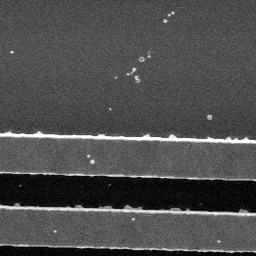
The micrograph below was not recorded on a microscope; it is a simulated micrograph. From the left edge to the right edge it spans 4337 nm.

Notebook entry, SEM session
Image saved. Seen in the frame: lines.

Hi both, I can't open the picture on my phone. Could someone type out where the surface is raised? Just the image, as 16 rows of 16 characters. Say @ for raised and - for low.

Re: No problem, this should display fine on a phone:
----------------
----------------
----------------
----------------
----------------
----------------
----------------
----------------
@@@@------------
@@@@@@@@@@@@@@@@
@@@@@@@@@@@@@@@@
----------------
----------------
@@@@@@@@@@@@@@@@
@@@@@@@@@@@@@@@@
------@@@@@@@@@@